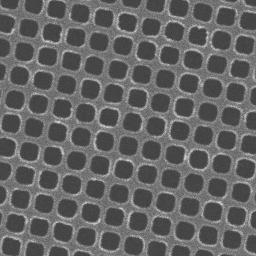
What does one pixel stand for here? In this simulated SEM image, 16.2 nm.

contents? a regular array of holes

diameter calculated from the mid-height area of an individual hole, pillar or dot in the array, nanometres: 323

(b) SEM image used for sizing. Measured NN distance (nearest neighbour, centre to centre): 385 nanometres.